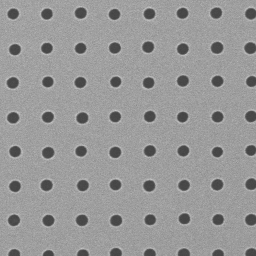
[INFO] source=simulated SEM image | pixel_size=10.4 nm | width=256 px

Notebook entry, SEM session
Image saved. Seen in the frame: a regular array of holes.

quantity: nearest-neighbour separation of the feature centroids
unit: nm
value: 346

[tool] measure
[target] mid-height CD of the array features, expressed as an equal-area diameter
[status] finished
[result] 0.119 microns